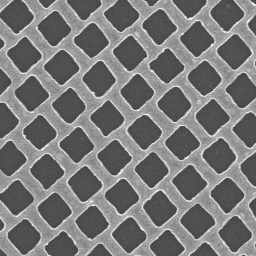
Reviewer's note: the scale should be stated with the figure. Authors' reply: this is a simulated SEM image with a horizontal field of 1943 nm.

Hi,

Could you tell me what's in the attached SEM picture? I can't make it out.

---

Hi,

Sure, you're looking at a regular array of holes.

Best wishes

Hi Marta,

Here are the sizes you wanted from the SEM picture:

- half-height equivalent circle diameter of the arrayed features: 232 nm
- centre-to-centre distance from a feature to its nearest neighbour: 0.298 um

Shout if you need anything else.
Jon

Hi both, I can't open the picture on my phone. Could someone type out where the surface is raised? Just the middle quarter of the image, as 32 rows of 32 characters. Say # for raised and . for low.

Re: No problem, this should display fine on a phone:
....###....####....##.........##
....##.....#####.#####........##
...##.......######.####......##.
..###........####...####....###.
.####........###.....####.#####.
######......###......###########
#.####.....###........####...###
...#####..####........###.....##
....###########.......##.......#
.....#####..####....###........#
.....####....####...###.........
.....###.....###########.......#
....###.......###########.....##
...####........####..#####...###
..#####........##......#########
########......###......######.##
##...####....###........####...#
#....#####.#####........###.....
......###########.......##......
.......#####..####.....##.......
........###....####..####.......
.......##......###########......
#.....##........#####..####....#
##...###.........###....####..##
##..#####.......###......#######
##########.....###........#####.
####...####...####........####..
###....#####.#####........##....
#.......###########......##.....
#........####...####....###.....
#.........##.....####..#####....
##.......##.......###########...